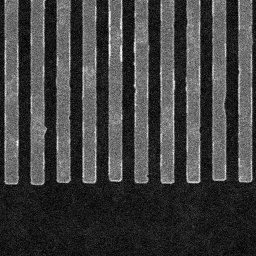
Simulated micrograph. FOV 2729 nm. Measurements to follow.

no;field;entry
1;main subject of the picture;parallel lines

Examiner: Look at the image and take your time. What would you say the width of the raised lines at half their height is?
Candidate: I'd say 142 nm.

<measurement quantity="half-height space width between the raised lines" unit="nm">133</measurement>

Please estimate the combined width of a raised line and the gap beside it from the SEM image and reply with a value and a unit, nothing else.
277 nm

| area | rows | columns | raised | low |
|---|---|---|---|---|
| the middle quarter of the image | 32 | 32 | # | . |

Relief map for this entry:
#....###...###....###...###....#
#....###...###....###...###....#
#....###...###....###...###....#
#....###...###....###...###....#
#....###...###....###...####...#
#....###...###....###...####...#
#....###...###....###...####...#
#....###...###....###...###....#
#....###...###....###...###....#
#....###...###....###...###....#
#....###...###....###...###....#
#....###...###....###...###....#
#....###...###....###...###....#
#....###...###....###...###....#
#....###...###....###...###....#
#....###...###....###...###....#
#....###...###....###...###....#
#....###...###....###...###....#
#....###...###....###...###....#
#....###...###....###...###....#
#....###...###....###...###....#
#....###...###....###...###....#
#....###...###....###...###....#
#....###...###....###...###....#
#....###...###....###...###....#
#....###...###....###...###....#
#....###...###....###...###....#
#....###...###....###...###....#
#....###...###....###...###....#
#....###..........###...###....#
................................
................................